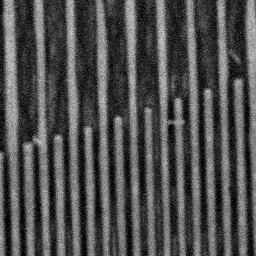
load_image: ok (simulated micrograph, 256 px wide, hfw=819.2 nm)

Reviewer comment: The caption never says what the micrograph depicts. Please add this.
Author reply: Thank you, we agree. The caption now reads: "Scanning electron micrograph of parallel lines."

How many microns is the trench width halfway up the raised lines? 0.0264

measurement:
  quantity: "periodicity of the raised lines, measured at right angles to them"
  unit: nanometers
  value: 48.5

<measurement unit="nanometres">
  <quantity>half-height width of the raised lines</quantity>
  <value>20.4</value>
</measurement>